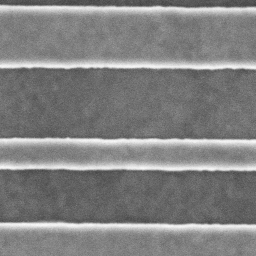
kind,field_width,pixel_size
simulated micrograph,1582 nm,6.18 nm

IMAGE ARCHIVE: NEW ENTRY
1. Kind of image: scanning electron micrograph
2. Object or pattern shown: lines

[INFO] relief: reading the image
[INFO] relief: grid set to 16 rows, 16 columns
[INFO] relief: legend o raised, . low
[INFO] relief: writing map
oooooooooooo....
oooooooooooooooo
oooooooooooooooo
oooooooooooooooo
................
................
................
................
................
oooooooooooooooo
oooooooooooooooo
................
................
................
oooooooooooooooo
oooooooooooooooo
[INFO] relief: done